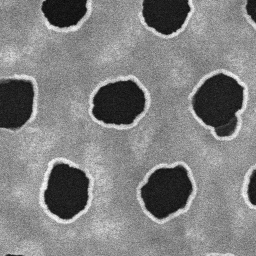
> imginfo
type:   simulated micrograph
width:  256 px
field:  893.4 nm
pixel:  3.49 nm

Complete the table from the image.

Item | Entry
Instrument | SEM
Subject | holes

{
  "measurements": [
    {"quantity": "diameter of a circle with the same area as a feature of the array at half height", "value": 172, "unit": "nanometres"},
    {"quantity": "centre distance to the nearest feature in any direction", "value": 350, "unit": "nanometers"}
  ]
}